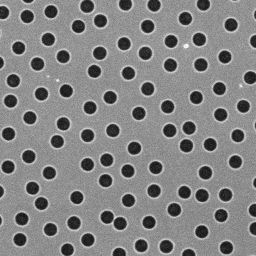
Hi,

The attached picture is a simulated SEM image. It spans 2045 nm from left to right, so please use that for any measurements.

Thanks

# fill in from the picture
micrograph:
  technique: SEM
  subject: a regular array of holes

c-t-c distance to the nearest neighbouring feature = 23.8 pixels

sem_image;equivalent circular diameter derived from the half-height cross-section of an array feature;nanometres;106